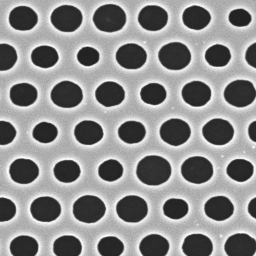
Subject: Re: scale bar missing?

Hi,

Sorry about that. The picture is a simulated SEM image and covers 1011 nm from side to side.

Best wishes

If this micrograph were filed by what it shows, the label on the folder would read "a regular array of holes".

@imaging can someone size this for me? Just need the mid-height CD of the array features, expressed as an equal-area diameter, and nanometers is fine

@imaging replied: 106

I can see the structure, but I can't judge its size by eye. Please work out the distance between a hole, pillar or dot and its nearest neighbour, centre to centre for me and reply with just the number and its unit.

170 nanometers